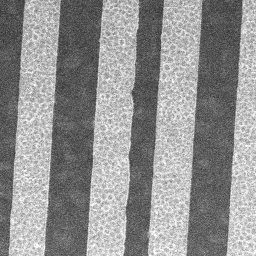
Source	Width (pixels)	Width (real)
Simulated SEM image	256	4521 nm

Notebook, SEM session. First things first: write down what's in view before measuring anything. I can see one or a few lines or trenches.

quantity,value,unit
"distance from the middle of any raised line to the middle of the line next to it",70.2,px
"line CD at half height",571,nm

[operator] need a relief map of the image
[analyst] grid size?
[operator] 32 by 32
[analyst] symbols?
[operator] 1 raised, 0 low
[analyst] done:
00011110000001111000011110000011
00011110000001111000011110000011
00011110000001111000111110000011
00011110000001111000111110000011
00011110000001111000111110000011
00011110000001111000111110000011
00011110000001111000111110000011
00011110000011111000111110000011
00011110000011111000111110000011
00011110000011111000111110000011
00111110000011111000111110000011
00111110000011110000111110000011
00111110000011110000111100000011
00111110000011111000111100000011
00111100000011110000111100000111
00111100000011110000111100000111
00111100000011110000111100000111
00111100000011110001111100000111
00111100000011110001111100000111
00111100000011110001111100000111
00111100000011110001111100000111
00111100000011110001111100000111
00111100000011110001111100000111
00111100000111110001111100000111
00111100000111110001111100000111
00111100000111110001111100000111
01111100000111110001111100000111
01111100000111110001111000000111
01111100000111110001111000000111
01111100000111100001111000000111
01111100000111100001111000000111
01111000000111100001111000001111